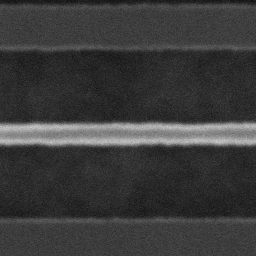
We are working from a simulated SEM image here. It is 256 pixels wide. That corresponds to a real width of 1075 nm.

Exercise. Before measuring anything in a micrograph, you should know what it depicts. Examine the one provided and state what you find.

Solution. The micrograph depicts lines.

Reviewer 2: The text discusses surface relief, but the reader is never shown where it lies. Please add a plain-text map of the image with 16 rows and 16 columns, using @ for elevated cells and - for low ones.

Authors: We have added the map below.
@@@@@@@@@@@@@@@@
@@@@@@@@@@@@@@@@
@@@@@@@@@@@@@@@@
----------------
----------------
----------------
----------------
----------------
----------------
----------------
----------------
----------------
----------------
----------------
@@@@@@@@@@@@@@@@
@@@@@@@@@@@@@@@@